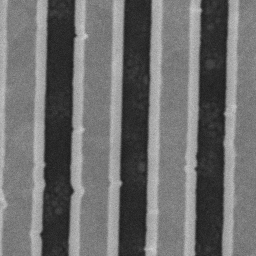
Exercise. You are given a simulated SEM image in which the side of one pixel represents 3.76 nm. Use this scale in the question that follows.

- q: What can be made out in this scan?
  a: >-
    one or a few lines or trenches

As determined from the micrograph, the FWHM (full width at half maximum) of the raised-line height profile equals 146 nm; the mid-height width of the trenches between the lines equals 142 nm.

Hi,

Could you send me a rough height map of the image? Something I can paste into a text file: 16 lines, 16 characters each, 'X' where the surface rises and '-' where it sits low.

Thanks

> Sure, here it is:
XXX--XX---XX---X
XXX--XX---XX---X
XXX--XX---XX---X
XXX--XX---XX--XX
XXX--XX---XX--XX
XXX--XX---XX--XX
XXX--XX---XX--XX
XX---XX---XX--XX
XX---XX---XX--XX
XX---XX---XX--XX
XX---XX---XX--XX
XX---XX---XX--XX
XX---XX--XXX--XX
XX---XX--XXX--XX
XX---XX---XX--XX
XX---XX--XXX--XX